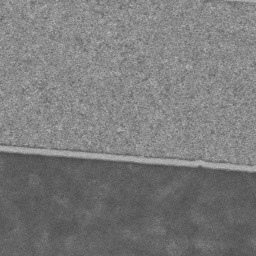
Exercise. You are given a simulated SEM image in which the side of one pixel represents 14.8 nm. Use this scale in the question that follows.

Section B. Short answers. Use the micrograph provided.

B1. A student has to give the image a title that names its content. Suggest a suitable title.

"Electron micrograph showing one or a few lines or trenches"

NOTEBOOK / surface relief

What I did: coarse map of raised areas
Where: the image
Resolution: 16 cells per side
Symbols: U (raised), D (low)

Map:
UUUUUUUUUUUUUUUU
UUUUUUUUUUUUUUUU
UUUUUUUUUUUUUUUU
UUUUUUUUUUUUUUUU
UUUUUUUUUUUUUUUU
UUUUUUUUUUUUUUUU
UUUUUUUUUUUUUUUU
UUUUUUUUUUUUUUUU
UUUUUUUUUUUUUUUU
DDDUUUUUUUUUUUUU
DDDDDDDDDDDDDDDU
DDDDDDDDDDDDDDDD
DDDDDDDDDDDDDDDD
DDDDDDDDDDDDDDDD
DDDDDDDDDDDDDDDD
DDDDDDDDDDDDDDDD